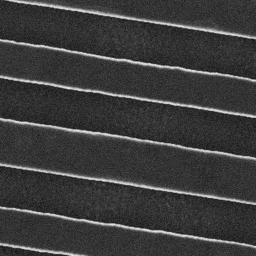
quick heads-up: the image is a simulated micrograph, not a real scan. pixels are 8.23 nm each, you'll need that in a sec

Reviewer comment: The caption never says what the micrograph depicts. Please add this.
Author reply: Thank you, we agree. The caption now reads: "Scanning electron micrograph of lines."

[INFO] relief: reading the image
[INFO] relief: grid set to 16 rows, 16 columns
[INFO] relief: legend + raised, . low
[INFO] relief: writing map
....++++++++++++
..........++++++
................
++++++..........
+++++++++++++...
....++++++++++++
...........+++++
+...............
+++++++.........
++++++++++++++..
.+++++++++++++++
........++++++++
..............++
++++............
++++++++++......
.+++++++++++++++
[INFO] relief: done